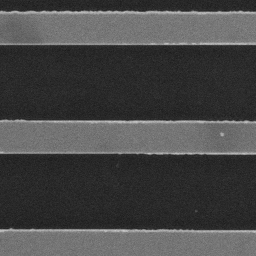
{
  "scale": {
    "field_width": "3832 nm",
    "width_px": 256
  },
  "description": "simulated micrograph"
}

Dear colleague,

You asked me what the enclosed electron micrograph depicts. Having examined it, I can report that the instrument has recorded lines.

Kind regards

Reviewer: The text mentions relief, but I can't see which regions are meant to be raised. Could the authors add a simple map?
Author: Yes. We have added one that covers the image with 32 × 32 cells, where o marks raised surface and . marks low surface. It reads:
................................
ooooooooo.ooooooo.ooo........o..
oooooooooooooooooooooooooooooooo
oooooooooooooooooooooooooooooooo
oooooooooooooooooooooooooooooooo
oooooooooooooooooooooooooooooooo
................................
................................
................................
................................
................................
................................
................................
................................
................................
oooooooooooooooooooooooooooooooo
oooooooooooooooooooooooooooooooo
oooooooooooooooooooooooooooooooo
oooooooooooooooooooooooooooooooo
................................
................................
................................
................................
................................
................................
................................
................................
................................
................................
oooooooooooooooooooooooooooooooo
oooooooooooooooooooooooooooooooo
oooooooooooooooooooooooooooooooo